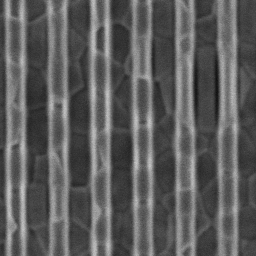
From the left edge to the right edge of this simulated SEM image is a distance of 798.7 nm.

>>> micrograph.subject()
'parallel lines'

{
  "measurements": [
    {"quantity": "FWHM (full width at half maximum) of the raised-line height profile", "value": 52.2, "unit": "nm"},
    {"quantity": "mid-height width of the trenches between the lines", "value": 78.3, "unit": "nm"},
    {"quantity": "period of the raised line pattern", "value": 0.132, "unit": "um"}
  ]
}